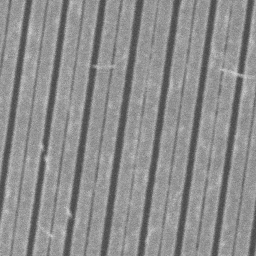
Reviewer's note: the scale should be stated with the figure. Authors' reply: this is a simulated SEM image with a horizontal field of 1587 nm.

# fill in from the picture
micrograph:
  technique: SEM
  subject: parallel lines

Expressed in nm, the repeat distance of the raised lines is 113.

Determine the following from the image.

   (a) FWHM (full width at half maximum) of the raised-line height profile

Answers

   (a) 0.0828 micrometres